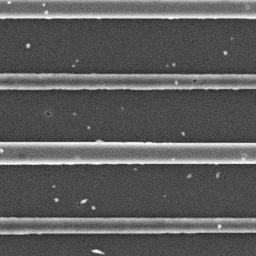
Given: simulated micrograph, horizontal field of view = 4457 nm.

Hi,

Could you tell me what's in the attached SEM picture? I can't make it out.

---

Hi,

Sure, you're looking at lines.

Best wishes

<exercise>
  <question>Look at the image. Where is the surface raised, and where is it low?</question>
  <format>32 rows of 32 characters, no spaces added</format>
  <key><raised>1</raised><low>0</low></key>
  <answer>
11111111111111111111111111111111
11111111111111111111111111111111
00000000000000000000000000000000
00000000000000000000000000000000
00000000000000000000000000000000
00000000000000000000000000000000
00000000000000000000000000000000
00000000000000000000000000000000
00000000000000000000000000000000
11111111111111111111111111111111
11111111111111111111111111111111
00000000000000000000000000000000
00000000000000000000000000000000
00000000000000000000000000000000
00000000000000000000000000000000
00000000000000000000000000000000
00000000000000000000000000000000
00000000000000000000000000000000
11111111111111111111111111111111
11111111111111111111111111111111
00000000000000000000000000000000
00000000000000000000000000000000
00000000000000000000000000000000
00000000000000000000000000000000
00000000000000000000000000000000
00000000000000000000000000000000
00000000000000000000000000000000
11111111111111111111111111111111
11111111111111111111111111111111
00000000000000000000000000000000
00000000000000000000000000000000
00000000000000000000000000000000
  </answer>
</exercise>